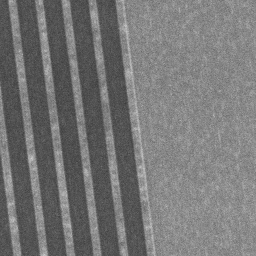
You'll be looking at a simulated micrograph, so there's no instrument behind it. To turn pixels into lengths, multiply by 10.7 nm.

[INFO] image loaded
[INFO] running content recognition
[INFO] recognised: parallel lines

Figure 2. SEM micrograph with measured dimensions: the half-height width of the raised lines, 81.1 nm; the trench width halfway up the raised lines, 203 nm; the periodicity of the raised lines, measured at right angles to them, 285 nm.